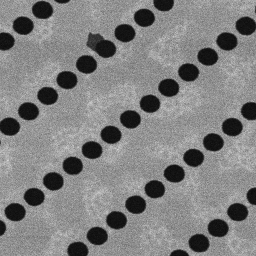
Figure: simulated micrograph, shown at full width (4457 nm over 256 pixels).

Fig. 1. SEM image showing a regular array of holes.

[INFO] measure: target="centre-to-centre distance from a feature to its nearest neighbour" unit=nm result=430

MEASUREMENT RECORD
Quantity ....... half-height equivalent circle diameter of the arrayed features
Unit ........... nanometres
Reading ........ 344